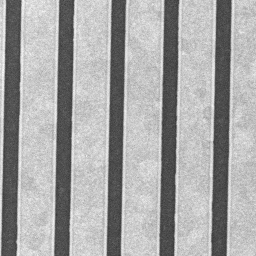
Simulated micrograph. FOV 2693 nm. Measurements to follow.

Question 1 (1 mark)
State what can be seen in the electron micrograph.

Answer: parallel lines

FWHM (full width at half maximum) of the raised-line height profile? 0.368 microns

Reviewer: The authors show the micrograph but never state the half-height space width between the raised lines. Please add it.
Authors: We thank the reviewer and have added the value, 184 nm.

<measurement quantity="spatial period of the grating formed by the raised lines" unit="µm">0.551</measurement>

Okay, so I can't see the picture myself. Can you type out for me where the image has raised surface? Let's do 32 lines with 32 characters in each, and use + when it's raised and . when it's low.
+..++++..+++++..++++...++++..+++
+..++++..+++++..++++...++++..+++
+..++++..+++++..++++...++++..+++
+..++++..+++++..++++..+++++..+++
+..++++..+++++..++++..+++++..+++
+..++++..+++++..++++..+++++..+++
...++++..+++++..++++..+++++..+++
...++++..+++++..++++..+++++..+++
...++++..+++++..++++..+++++..+++
...++++..+++++..++++..+++++..+++
...++++..+++++..++++..+++++..+++
...++++..++++...++++..+++++..+++
...++++..++++...++++..+++++..+++
...++++..++++...++++..+++++..+++
...++++..++++...++++..+++++..+++
...++++..++++...++++..+++++..+++
...++++..++++...++++..+++++..+++
...++++..++++...++++..++++...+++
...++++..++++...++++..++++...+++
...++++..++++...++++..++++...+++
...++++..++++...++++..++++...+++
..+++++..++++..+++++..++++...+++
..+++++..++++..+++++..++++...+++
..+++++..++++..+++++..++++...+++
..+++++..++++..+++++..++++...+++
..+++++..++++..+++++..++++...+++
..+++++..++++..+++++..++++...+++
..+++++..++++..+++++..++++...+++
..+++++..++++..+++++..++++...+++
..+++++..++++..+++++..++++...+++
..+++++..++++..+++++..++++...+++
..+++++..++++..+++++..++++...+++